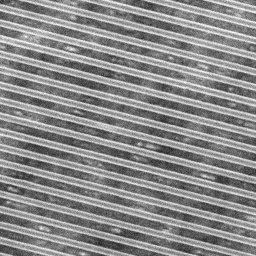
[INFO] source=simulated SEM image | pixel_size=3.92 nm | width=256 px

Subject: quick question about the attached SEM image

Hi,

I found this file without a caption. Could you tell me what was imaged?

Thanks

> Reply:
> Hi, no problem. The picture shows parallel lines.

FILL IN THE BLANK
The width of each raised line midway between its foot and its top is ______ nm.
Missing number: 23.3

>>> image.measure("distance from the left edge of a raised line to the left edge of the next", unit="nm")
59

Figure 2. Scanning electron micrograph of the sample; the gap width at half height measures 35.1 nm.